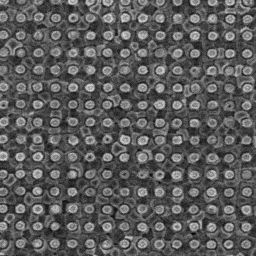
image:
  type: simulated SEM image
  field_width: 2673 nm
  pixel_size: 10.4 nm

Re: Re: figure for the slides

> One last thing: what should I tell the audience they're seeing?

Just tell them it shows a regular array of raised bodies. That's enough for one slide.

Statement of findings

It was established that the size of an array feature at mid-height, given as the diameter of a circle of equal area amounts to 0.0916 micrometres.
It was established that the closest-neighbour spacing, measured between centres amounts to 0.0968 um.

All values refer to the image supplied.